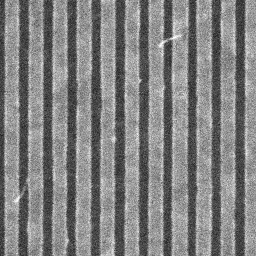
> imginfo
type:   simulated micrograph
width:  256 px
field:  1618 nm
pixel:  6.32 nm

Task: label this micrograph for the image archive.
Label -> parallel lines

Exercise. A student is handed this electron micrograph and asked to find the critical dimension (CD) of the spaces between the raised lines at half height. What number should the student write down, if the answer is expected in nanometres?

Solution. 66.3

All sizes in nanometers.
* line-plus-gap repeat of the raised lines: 152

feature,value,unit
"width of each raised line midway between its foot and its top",84.5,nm